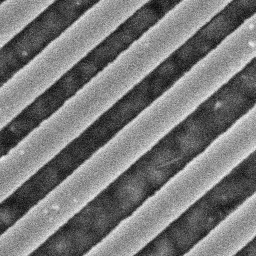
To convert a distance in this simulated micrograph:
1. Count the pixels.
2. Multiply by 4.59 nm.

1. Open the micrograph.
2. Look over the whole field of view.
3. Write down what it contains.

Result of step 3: lines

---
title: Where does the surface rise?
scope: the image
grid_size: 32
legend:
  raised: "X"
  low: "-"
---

XXXXXX------XXXXXX----XXXXXX----
XXXXX------XXXXXX----XXXXXX-----
XXXX------XXXXXX----XXXXXX-----X
XXX------XXXXXX----XXXXXX-----XX
XX-----XXXXXX-----XXXXXX-----XXX
X-----XXXXXX----XXXXXXX----XXXXX
-----XXXXXX----XXXXXXX----XXXXXX
----XXXXXX----XXXXXX-----XXXXXX-
---XXXXXX----XXXXXX-----XXXXXX--
--XXXXXX----XXXXXX-----XXXXXX---
-XXXXXX----XXXXXX-----XXXXXX----
XXXXX-----XXXXXX-----XXXXXX-----
XXXX----XXXXXXX-----XXXXXX------
XXX-----XXXXXX----XXXXXX--------
XX----XXXXXX-----XXXXXX-------XX
X----XXXXXX-----XXXXXX-------XXX
----XXXXXX-----XXXXXX-------XXXX
---XXXXXX-----XXXXXX-------XXXXX
--XXXXXX-----XXXXXX-------XXXXXX
-XXXXXX-----XXXXXX-------XXXXXX-
XXXXXX----XXXXXXX-------XXXXXX--
XXXX-----XXXXXX-------XXXXXXX---
XXX-----XXXXXX-------XXXXXXX----
XX-----XXXXXX-------XXXXXX------
X-----XXXXXX-------XXXXXX------X
-----XXXXXX-------XXXXXX------XX
----XXXXXX-------XXXXXX------XXX
--XXXXXX--------XXXXXX------XXXX
-XXXXXX-------XXXXXXX------XXXXX
XXXXXX-------XXXXXXX------XXXXXX
XXXXX-------XXXXXX-------XXXXXX-
XXXX-------XXXXXX-------XXXXXX--